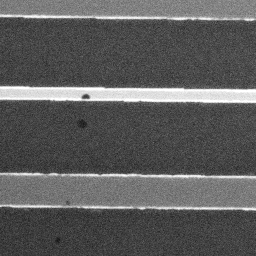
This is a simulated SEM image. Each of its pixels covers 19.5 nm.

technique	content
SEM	lines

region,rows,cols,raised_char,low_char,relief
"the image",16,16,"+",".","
++++++++++++++++
................
................
................
................
................
................
................
................
................
................
++++++++++++++++
++++++++++++++++
................
................
................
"